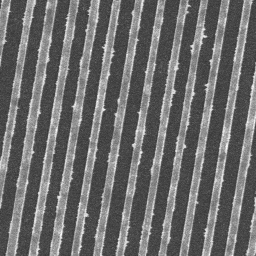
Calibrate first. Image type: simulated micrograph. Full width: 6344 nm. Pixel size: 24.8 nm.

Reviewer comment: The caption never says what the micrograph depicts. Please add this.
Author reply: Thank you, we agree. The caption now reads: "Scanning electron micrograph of parallel lines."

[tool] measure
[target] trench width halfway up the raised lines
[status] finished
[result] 333 nanometers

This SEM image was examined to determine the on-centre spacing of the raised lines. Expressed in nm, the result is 533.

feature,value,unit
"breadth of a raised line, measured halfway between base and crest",8.02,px